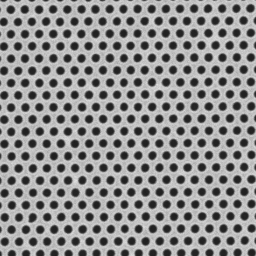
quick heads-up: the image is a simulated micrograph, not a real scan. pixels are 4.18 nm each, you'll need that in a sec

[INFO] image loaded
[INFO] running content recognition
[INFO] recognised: a regular array of holes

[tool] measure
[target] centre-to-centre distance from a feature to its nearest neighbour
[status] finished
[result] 0.0578 um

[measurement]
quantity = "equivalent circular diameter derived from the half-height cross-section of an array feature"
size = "0.0359 micrometres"